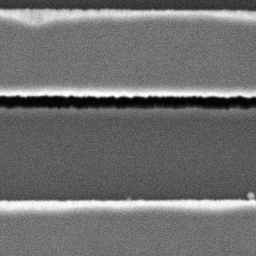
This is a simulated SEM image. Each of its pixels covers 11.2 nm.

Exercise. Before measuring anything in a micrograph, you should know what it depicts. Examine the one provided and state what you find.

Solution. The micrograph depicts lines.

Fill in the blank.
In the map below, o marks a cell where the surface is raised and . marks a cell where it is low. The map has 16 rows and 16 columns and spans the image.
................
oooooooooooooooo
oooooooooooooooo
oooooooooooooooo
oooooooooooooooo
oooooooooooooooo
................
................
................
................
................
................
................
oooooooooooooooo
oooooooooooooooo
oooooooooooooooo